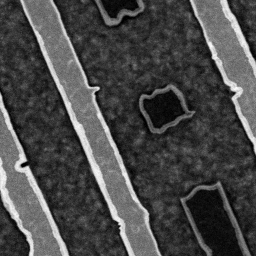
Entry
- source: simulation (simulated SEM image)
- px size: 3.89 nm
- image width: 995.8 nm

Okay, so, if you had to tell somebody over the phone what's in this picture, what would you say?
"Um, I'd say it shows one or a few lines or trenches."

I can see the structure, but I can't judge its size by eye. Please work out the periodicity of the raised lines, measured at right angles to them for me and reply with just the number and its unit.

310 nm